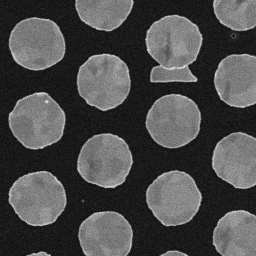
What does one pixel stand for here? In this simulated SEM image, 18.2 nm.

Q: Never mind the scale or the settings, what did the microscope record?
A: a regular array of raised bodies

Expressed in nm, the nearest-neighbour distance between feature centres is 1400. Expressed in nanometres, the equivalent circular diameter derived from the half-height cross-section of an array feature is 988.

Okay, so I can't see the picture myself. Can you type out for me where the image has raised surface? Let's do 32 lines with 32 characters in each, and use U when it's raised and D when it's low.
DDDDDDDDDDUUUUUUUDDDDDDDDDDUUUUU
DDDDDDDDDDUUUUUUDDDDDDDDDDDUUUUU
DDDUUUDDDDUUUUUUDDDDUUUDDDDUUUUU
DDUUUUUDDDDDUUDDDDDUUUUUUDDDDUUD
DUUUUUUUDDDDDDDDDDUUUUUUUDDDDDDD
DUUUUUUUDDDDDDDDDDUUUUUUUDDDDDDD
DUUUUUUUDDDDDDDDDDDUUUUUUDDDDDDD
DDUUUUUUDDDUUUUDDDDUUUUUDDDDUUUU
DDDUUUDDDDUUUUUUDDDUUUUUDDDUUUUU
DDDDDDDDDDUUUUUUDDDUUUUUDDDUUUUU
DDDDDDDDDDUUUUUUDDDDDDDDDDDUUUUU
DDDDDDDDDDUUUUUUDDDDDDDDDDDUUUUU
DDDUUUUDDDDUUUUDDDDDUUUUDDDDUUUU
DDUUUUUUDDDDUUDDDDDUUUUUUDDDDDDD
DUUUUUUUDDDDDDDDDDUUUUUUUDDDDDDD
DUUUUUUUDDDDDDDDDDUUUUUUUDDDDDDD
DDUUUUUUDDDDDDDDDDDUUUUUUDDDDDDD
DDUUUUUDDDDUUUUDDDDUUUUUDDDDUUUU
DDDDUDDDDDUUUUUUDDDDDDDDDDDUUUUU
DDDDDDDDDDUUUUUUDDDDDDDDDDDUUUUU
DDDDDDDDDDUUUUUUDDDDDDDDDDDUUUUU
DDDDDUDDDDUUUUUUDDDDDUUDDDDUUUUU
DDUUUUUDDDDUUUUDDDDUUUUUDDDDUUUU
DUUUUUUUDDDDDDDDDDDUUUUUUDDDDDDD
DUUUUUUUDDDDDDDDDDUUUUUUUDDDDDDD
DUUUUUUUDDDDDDDDDDDUUUUUUDDDDDDD
DDUUUUUUDDDDDDDDDDDUUUUUUDDDDUUD
DDDUUUUDDDDUUUUUDDDDUUUUDDDDUUUU
DDDDDDDDDDUUUUUUDDDDDDDDDDDUUUUU
DDDDDDDDDDUUUUUUUDDDDDDDDDDUUUUU
DDDDDDDDDDUUUUUUDDDDDDDDDDDUUUUU
DDDDDDDDDDDUUUUUDDDDDUDDDDDUUUUU